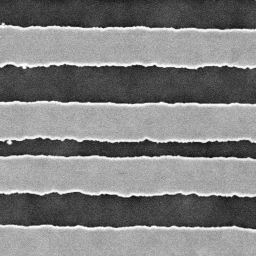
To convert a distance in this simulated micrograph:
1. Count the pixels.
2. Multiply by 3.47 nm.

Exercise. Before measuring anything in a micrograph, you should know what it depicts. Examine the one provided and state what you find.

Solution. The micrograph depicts lines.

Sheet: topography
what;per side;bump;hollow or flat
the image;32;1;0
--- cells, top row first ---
00000000000000000000000000000000
00000000000000000000000000000000
00000000000000000000000000000000
11111111110001111110000000000000
11111111111111111111111111111111
11111111111111111111111111111111
11111111111111111111111111111111
11111111111111111111111111111111
00000000000000000000000110000011
00000000000000000000000000000000
00000000000000000000000000000000
00000000000000000000000000000000
00000000000000000000000000000000
11111111111111111111111111111111
11111111111111111111111111111111
11111111111111111111111111111111
11111111111111111111111111111111
11100000011011111101111111111101
00000000000000000000000000000000
00010000000000000000000000000000
11111111111111111111111111111111
11111111111111111111111111111111
11111111111111111111111111111111
11111111111111111111111111111111
00000000000000010000000000000011
00000000000000000000000000000000
00000000000000000000000000000000
00000000000000000000000000000000
11111111111011011111111110011100
11111111111111111111111111111111
11111111111111111111111111111111
11111111111111111111111111111111